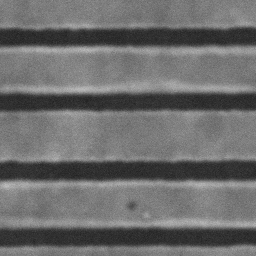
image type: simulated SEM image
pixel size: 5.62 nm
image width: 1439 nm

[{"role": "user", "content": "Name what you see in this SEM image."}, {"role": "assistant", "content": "lines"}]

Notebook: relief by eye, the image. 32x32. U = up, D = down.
UUUUUUUUUUUUUUUUUUUUUUUUUUUUUUUU
UUUUUUUUUUUUUUUUUUUUUUUUUUUUUUUU
UUUUUUUUUUUUUUUUUUUUUUUUUUUUUUUU
DDDUUUUUDUDUDUDDDDDDDDDDDDDUDDDD
DDDDDDDDDDDDDDDDDDDDDDDDDDDDDDDD
DDDDDDDDDDDDDDDDDDDDDDDDDDDDDDDD
UUUUUUUUUUUUUUUUUUUUUUUUUUUUUUUU
UUUUUUUUUUUUUUUUUUUUUUUUUUUUUUUU
UUUUUUUUUUUUUUUUUUUUUUUUUUUUUUUU
UUUUUUUUUUUUUUUUUUUUUUUUUUUUUUUU
UUUUUUUUUUUUUUUUUUUUUUUUUUUUUUUU
DDDDUUUUUUUUUDDDDDDDDDDDDDDDDDDD
DDDDDDDDDDDDDDDDDDDDDDDDDDDDDDDD
DDDDDDDDDDDDDDDDDDDDDDDDDDDDDDDD
UUUUUUUUUUUUUUUUUUUUUUUUUUUUUUUU
UUUUUUUUUUUUUUUUUUUUUUUUUUUUUUUU
UUUUUUUUUUUUUUUUUUUUUUUUUUUUUUUU
UUUUUUUUUUUUUUUUUUUUUUUUUUUUUUUU
UUUUUUUUUUUUUUUUUUUUUUUUUUUUUUUU
UUUUUUUUUUUUUUUUUUUUUUUUUUUUUUUU
DDDDDDDDDDDDDDDDDDDDDDDDDDDDDDDD
DDDDDDDDDDDDDDDDDDDDDDDDDDDDDDDD
DDDDDDDDDDDDDDDDDDDDDDDDDDDDDDDD
UUUUUUUUUUUUUUUUUUUUUUUUUUUUUUUU
UUUUUUUUUUUUUUUUUUUUUUUUUUUUUUUU
UUUUUUUUUUUUUUUUUUUUUUUUUUUUUUUU
UUUUUUUUUUUUUUUUUUUUUUUUUUUUUUUU
UUUUUUUUUUUUUUUUUUUUUUUUUUUUUUUU
DDDDDDDDDDDDDDDDDDDDDDDDDDDDDDDD
DDDDDDDDDDDDDDDDDDDDDDDDDDDDDDDD
DDDDDDDDDDDDDDDDDDDDDDDDDDDDDDDD
UUUUUUUUUUUUUUUUUUUUUUUUUUUUUUUU